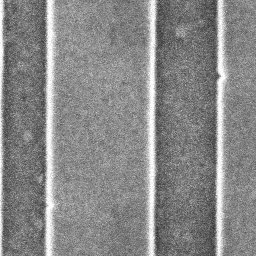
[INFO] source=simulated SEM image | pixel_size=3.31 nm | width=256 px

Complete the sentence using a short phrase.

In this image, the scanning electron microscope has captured one or a few lines or trenches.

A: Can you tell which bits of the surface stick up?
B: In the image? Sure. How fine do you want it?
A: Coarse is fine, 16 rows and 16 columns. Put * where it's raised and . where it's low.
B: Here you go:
...*******....**
...*******....**
...*******....**
...*******....**
...*******....**
...*******....**
...*******....**
...******.....**
...******.....**
...******.....**
...******.....**
...******.....**
...******.....**
...******.....**
...******.....**
...******.....**